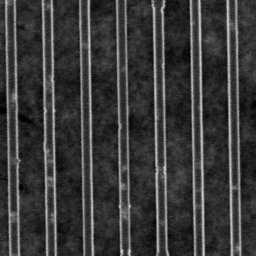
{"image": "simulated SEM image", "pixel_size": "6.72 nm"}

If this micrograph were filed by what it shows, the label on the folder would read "parallel lines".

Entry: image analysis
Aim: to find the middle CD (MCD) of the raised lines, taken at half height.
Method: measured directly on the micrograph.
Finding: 0.0622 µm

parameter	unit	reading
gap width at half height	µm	0.186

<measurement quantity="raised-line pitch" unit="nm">248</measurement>